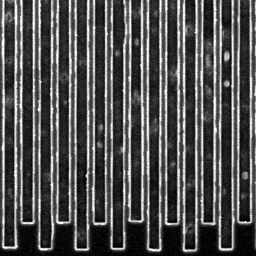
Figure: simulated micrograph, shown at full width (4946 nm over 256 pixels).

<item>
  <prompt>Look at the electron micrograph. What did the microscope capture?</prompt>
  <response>parallel lines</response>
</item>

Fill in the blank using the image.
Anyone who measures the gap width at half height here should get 220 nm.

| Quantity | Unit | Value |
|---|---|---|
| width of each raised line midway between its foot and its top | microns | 0.135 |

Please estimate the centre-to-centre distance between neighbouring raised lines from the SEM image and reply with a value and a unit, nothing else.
18.1 pixels